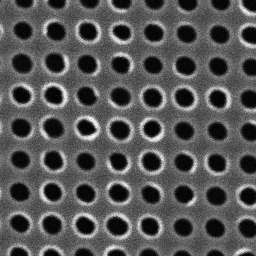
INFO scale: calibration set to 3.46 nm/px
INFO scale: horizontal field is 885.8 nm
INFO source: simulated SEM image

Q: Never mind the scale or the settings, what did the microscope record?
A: a regular array of holes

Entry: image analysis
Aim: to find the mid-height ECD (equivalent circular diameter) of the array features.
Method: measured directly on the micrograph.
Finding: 64.3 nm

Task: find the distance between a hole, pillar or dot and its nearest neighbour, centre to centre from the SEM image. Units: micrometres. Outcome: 0.109